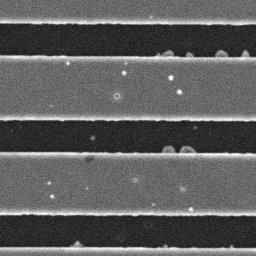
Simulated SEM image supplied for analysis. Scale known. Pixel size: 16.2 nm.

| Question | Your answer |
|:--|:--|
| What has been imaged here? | lines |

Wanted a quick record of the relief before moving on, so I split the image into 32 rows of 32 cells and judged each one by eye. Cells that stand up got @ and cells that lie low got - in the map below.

@@@@@@@@@@@@@@@@@@@@@@@@@@@@@@@@
@@@@@@@@@@@@@@@@@@@@@@@@@@@@@@@@
@@@@@@@@@@@@@@@@@@@@@@@@@@@@@@@@
--------------------------------
--------------------------------
--------------------------------
--------------------------------
@@@@@@@@@@@@@@@@@@@@@@@@@@@@@@@@
@@@@@@@@@@@@@@@@@@@@@@@@@@@@@@@@
@@@@@@@@@@@@@@@@@@@@@@@@@@@@@@@@
@@@@@@@@@@@@@@@@@@@@@@@@@@@@@@@@
@@@@@@@@@@@@@@@@@@@@@@@@@@@@@@@@
@@@@@@@@@@@@@@@@@@@@@@@@@@@@@@@@
@@@@@@@@@@@@@@@@@@@@@@@@@@@@@@@@
@@@@@@@@@@@@@@@@@@@@@@@@@@@@@@@@
--------------------------------
--------------------------------
--------------------------------
--------------------------------
@@@@@@@@@@@@@@@@@@@@@@@@@@@@@@@@
@@@@@@@@@@@@@@@@@@@@@@@@@@@@@@@@
@@@@@@@@@@@@@@@@@@@@@@@@@@@@@@@@
@@@@@@@@@@@@@@@@@@@@@@@@@@@@@@@@
@@@@@@@@@@@@@@@@@@@@@@@@@@@@@@@@
@@@@@@@@@@@@@@@@@@@@@@@@@@@@@@@@
@@@@@@@@@@@@@@@@@@@@@@@@@@@@@@@@
@@@@@@@@@@@@@@@@@@@@@@@@@@@@@@@@
--------------------------------
--------------------------------
--------------------------------
--------------------------------
@@@@@@@@@@@@@@@@@@@@@@@@@@@@@@@@